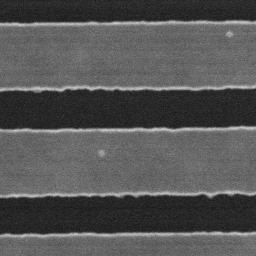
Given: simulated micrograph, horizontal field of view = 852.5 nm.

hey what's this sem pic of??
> lines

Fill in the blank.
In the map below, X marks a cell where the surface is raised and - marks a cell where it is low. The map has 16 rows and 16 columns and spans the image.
----------------
XXXXXXXXXXXXXXXX
XXXXXXXXXXXXXXXX
XXXXXXXXXXXXXXXX
XXXXXXXXXXXXXXXX
XXXXXXXXXXXXXXXX
----------------
----------------
XXXXXXXXXXXXXXXX
XXXXXXXXXXXXXXXX
XXXXXXXXXXXXXXXX
XXXXXXXXXXXXXXXX
----------------
----------------
----------------
XXXXXXXXXXXXXXXX